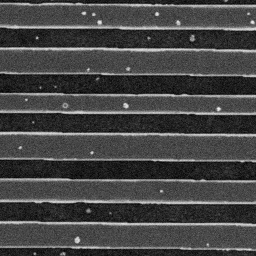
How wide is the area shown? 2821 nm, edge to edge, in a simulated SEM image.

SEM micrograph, lines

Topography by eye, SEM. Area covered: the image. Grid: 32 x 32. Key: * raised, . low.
****.******.....................
********************************
********************************
...............*****************
................................
................................
********************************
********************************
********************************
..............................**
................................
................................
********************************
********************************
................................
................................
................................
********************************
********************************
********************************
................................
................................
*********.......................
********************************
********************************
................................
................................
................................
********************************
********************************
********************************
................................